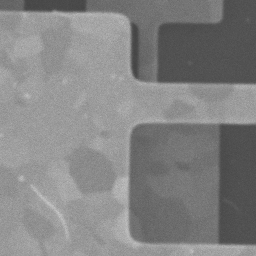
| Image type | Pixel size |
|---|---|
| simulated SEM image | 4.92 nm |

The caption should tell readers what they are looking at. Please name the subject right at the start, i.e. wiring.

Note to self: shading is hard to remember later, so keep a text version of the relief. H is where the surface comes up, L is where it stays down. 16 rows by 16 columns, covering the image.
LLLLLLLLLLLLLLLL
HHHHHHHHLLLLLLLL
HHHHHHHHLLLLLLLL
HHHHHHHHLLLLLLLL
HHHHHHHHLLLLLLLL
HHHHHHHHHHHHHHHH
HHHHHHHHHHHHHHHH
HHHHHHHHHHHHHHHH
HHHHHHHHLLLLLLLL
HHHHHHHHLLLLLLLL
HHHHHHHHLLLLLLLL
HHHHHHHHLLLLLLLL
HHHHHHHHLLLLLLLL
HHHHHHHHLLLLLLLL
HHHHHHHHLLLLLLLL
HHHHHHHHHHHHHHHH